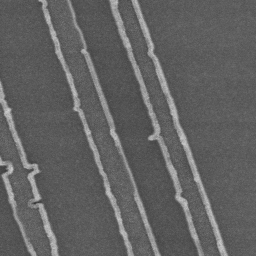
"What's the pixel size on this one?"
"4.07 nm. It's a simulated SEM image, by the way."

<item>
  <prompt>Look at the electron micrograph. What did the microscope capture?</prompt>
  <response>one or a few lines or trenches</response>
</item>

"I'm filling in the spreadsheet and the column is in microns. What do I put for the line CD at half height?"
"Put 0.108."